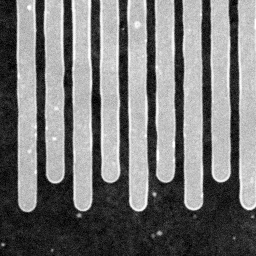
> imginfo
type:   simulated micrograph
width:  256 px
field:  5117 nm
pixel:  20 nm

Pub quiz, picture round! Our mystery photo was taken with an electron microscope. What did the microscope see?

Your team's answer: groups of lines, slits or small figures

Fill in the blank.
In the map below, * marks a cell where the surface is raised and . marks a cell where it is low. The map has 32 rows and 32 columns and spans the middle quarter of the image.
..*****..****...****...****...**
..*****..****...****...****...**
..*****..****...****...****...**
..*****..****...****...****...**
..*****..****...****...****...**
..*****..****...****...****...**
..*****..****...****...****...**
..*****..****...****...****...**
..****....***...****...****...**
..****....****..****...****...**
..****....****..****...****...**
..*****...***...****...****...**
..*****...***...****...****...**
...****...***....***...****...**
...***....***....***...*****..**
...***....***....***...*****..**
...****...***....***...*****..**
...****...***....***...****...**
..*****...***....***....***...**
..*****...***....***...****...**
..*****...***....***...****...**
...****...***....***...****...**
...****...***....***...****...**
...****...***....****..****...**
...****...***....****..****...**
...****...****...****..****...**
...****...****...****..****...**
...****...****..*****..****...**
...****...***...*****...***...**
...****.........*****.........**
...****.........*****.........**
...****..........****.........**